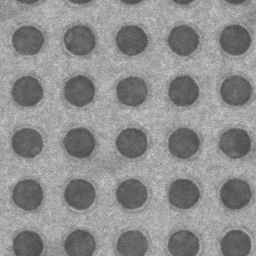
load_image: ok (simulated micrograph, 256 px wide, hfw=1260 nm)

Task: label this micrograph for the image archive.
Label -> a regular array of holes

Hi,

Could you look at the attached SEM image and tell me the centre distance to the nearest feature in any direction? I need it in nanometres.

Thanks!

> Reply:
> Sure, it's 250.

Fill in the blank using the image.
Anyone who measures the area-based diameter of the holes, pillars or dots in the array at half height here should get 159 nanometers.